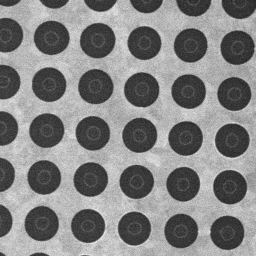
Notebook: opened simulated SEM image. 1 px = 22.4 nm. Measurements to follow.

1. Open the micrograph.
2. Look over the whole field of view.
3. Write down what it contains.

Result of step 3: an array of small figures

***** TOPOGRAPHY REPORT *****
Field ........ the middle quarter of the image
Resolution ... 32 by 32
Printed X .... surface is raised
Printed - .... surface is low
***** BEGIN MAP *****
XXXXXXXXXXXXXXXXXXXXXXXXXXXXXXXX
XXXXXX---XXXXXXXXXXXXXXXXXXXXXXX
XXXXX------XXXXXX-----XXXXXXXXXX
XXXX--------XXXX-------XXXXX----
-XXX---XX---XXX---------XXX-----
-XX---XXX---XXX---XXX---XXX-----
XXX----XX---XXX---XXX---XXX---XX
XXXX--------XXX---XXX---XXX---XX
XXXX-------XXXX--------XXXX-----
XXXXXX----XXXXXX-------XXXXX----
XXXXXXXXXXXXXXXXXX---XXXXXXXX---
XXXXXXXXXXXXXXXXXXXXXXXXXXXXXXXX
XXXXXXXXXXXXXXXXXXXXXXXXXXXXXXXX
XXXXX----XXXXXXXXX--XXXXXXXXXXXX
XXXX-------XXXXX------XXXXXXX---
XXX--------XXXX--------XXXX-----
XXX---XXX---XXX---X----XXXX-----
XXX---XXX---XX---XXX---XXX---XXX
XXX---XX---XXX----XX---XXX---XXX
XXX--------XXXX--------XXX---XXX
XXXX------XXXXX-------XXXXX-----
XXXXXX---XXXXXXX-----XXXXXX-----
XXXXXXXXXXXXXXXXXXXXXXXXXXXX----
XXXXXXXXXXXXXXXXXXXXXXXXXXXXXXXX
XXXXXX-XXXXXXXXXXXXXXXXXXXXXXXXX
XXXX-----XXXXXXX----XXXXXXXXXXXX
XXX-------XXXXX------XXXXXX-----
XXX---X----XXX--------XXXX------
XX---XXX---XXX---XX---XXXX------
XX---XXX---XXX---XXX---XX----XX-
XXX---X----XXX---XX----XX----XX-
XXX-------XXXX--------XXXX---X--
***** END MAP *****